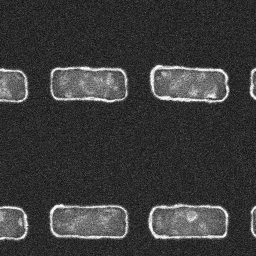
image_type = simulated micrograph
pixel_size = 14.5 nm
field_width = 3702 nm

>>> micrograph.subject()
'holes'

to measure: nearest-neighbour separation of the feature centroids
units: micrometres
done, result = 1.45